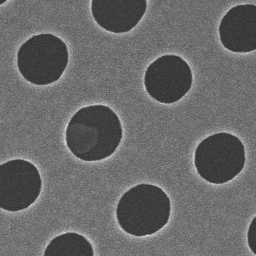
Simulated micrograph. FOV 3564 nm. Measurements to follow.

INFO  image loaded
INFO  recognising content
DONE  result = holes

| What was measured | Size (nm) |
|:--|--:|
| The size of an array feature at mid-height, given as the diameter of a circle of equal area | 718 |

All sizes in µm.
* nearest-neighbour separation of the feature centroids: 1.28